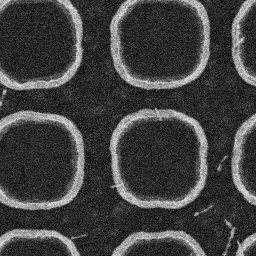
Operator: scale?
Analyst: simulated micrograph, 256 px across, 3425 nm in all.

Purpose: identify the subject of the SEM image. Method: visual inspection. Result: raised bodies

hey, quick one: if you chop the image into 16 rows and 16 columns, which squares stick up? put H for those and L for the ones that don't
HHHHLLLLHHHHLLLH
HHHHHLLHHHHHHLLH
HHHHHLLHHHHHHLLH
HHHHHLLHHHHHHLLH
HHHHLLLLHHHHLLLH
LLLLLLLLLLLLLLLL
LLLLLLLLLLLLLLLL
LHHHLLLLHHHHLLLL
HHHHHLLHHHHHHLLH
HHHHHLLHHHHHHLLH
HHHHHLLHHHHHHLLH
HHHHHLLHHHHHLLLH
HHHHLLLLHHHHLLLL
LLLLLLLLLLLLLLLL
LLLLLLLLLLLLLLLL
HHHHLLLLHHHHLLLH